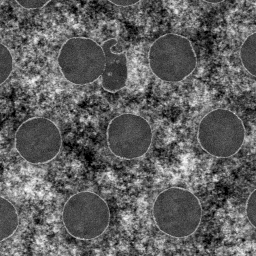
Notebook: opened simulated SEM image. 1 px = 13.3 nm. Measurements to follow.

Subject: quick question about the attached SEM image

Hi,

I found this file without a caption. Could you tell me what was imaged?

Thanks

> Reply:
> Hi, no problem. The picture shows raised bodies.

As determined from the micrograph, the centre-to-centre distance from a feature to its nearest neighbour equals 1180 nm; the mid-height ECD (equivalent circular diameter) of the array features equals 637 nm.